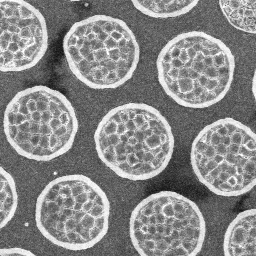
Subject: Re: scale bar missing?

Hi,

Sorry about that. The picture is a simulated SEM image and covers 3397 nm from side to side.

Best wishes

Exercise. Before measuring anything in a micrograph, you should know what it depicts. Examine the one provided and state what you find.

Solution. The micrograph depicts raised bodies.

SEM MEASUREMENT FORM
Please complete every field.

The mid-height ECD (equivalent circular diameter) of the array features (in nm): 934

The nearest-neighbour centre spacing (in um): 1.25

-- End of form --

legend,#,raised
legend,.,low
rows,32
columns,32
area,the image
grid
###..............#######........
#####.............#####.........
#####......###..................
######...#######................
######..#########......###......
######..#########....#######....
#####...#########...########....
#####....########...#########...
###......########...#########...
..........######....#########...
...........####.....#########...
...####..............#######....
..######..............#####.....
.########......####.............
.########.....######............
.########....########......###..
.########...#########....######.
.########...#########....#######
..######....#########...########
....###......########...########
..............#######...########
...............#####.....#######
#......####..............#######
##....######..............#####.
##...########......###..........
##...########.....######........
##...########....########......#
#....########....########.....##
.....########...#########....###
......#######....########...####
........###......########...####
###...............######....####